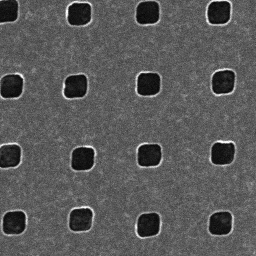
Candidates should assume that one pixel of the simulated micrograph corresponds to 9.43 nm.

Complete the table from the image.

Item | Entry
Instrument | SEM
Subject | a regular array of holes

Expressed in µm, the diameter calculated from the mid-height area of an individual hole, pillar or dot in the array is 0.233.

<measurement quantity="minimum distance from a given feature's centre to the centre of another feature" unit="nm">646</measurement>